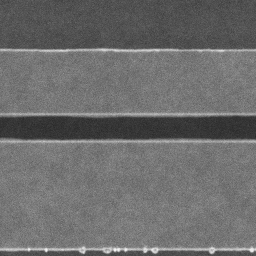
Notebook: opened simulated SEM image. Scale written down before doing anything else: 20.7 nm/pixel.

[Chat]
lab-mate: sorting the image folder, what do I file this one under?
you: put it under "lines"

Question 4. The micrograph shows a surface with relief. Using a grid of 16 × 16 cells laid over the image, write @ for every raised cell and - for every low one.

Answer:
----------------
----------------
----------------
@@@@@@@@@@@@@@@@
@@@@@@@@@@@@@@@@
@@@@@@@@@@@@@@@@
@@@@@@@@@@@@@@@@
----------------
----------------
@@@@@@@@@@@@@@@@
@@@@@@@@@@@@@@@@
@@@@@@@@@@@@@@@@
@@@@@@@@@@@@@@@@
@@@@@@@@@@@@@@@@
@@@@@@@@@@@@@@@@
@@@@@@@@@@@@@@@@